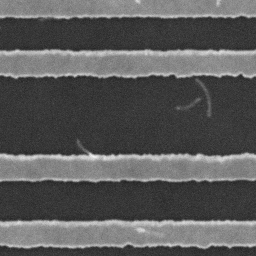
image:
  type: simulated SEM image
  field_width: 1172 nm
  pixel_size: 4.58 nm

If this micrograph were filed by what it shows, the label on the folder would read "lines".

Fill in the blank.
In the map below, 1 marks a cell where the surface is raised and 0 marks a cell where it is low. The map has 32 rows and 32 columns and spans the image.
11111111111111111111111111111111
11111111111111111111111111111111
00000000000000000000000000000000
00000000000000000000000000000000
00000000000000000000000000000000
00000000000000000000000000000000
00000010000000000000000000000000
11111111111111111111111111111111
11111111111111111111111111111111
01111010000011011100001100000001
00000000000000000000000000000000
00000000000000000000000000000000
00000000000000000000000000000000
00000000000000000000000000000000
00000000000000000000000000000000
00000000000000000000000000000000
00000000000000000000000000000000
00000000000000000000000000000000
00000000000000000000000000000000
00000000000000000000000000000011
11111111111111111111111111111111
11111111111111111111111111111111
11111111111111111111111111111101
00000000000000000000000000000000
00000000000000000000000000000000
00000000000000000000000000000000
00000000000000000000000000000000
00000000000000000000000000000000
11111111111111111111111111111111
11111111111111111111111111111111
11111111111111111111111111111111
00000000000000000000000000000000